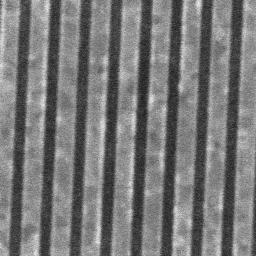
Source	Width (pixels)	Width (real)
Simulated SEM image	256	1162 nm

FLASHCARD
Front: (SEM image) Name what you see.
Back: parallel lines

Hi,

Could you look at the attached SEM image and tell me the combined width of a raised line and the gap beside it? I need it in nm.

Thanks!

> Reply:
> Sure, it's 137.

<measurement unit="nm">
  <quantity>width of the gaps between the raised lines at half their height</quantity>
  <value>60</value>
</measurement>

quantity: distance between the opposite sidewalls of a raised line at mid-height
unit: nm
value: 77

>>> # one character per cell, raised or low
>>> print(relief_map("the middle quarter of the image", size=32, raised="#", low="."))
###...#####...####....####...###
###...#####...####....####...###
###...#####...####....####...###
###...#####...####....####...###
###...#####...####....####...###
###...####....####....####...###
###...####....####....####...###
###...####....####...####....###
###...####....####...####....###
###...####....####...####....###
###...####....####...####....###
###...####....####...####....###
###...####....####...####....###
###...####....####...####....###
##....####....####...####....###
##....####....####...####....###
##....####....####...####....###
##....####...####....####....###
##....####...####....####....###
##....####...####....####...####
##....####...####....####...####
##...#####...####....####...####
##...#####...####....####...####
##...#####...####....####...####
##...#####...####....####...####
##...#####...####....####...####
##...#####...####....####...####
##...####....####....####...####
##...####....####....####...####
##...####....####...#####...####
##...####....####...####....####
##...####....####...####....####